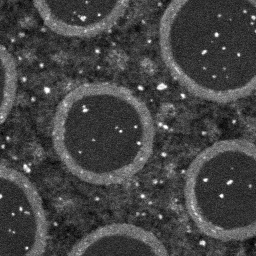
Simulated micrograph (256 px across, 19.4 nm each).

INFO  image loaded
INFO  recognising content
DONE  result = raised bodies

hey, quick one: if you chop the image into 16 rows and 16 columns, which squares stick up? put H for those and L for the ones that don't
LLLHHHHHLLLHHHHH
LLLHHHHLLLHHHHHH
LLLLLLLLLLHHHHHH
LLLLLLLLLLHHHHHH
HLLLLLLLLLLHHHHH
HLLLLLLLLLLLHHHH
LLLLHHHHHLLLLLLL
LLLLHHHHHLLLLLLL
LLLLHHHHHLLLLLLL
LLLLHHHHHLLLLHHH
LLLLLHHHLLLLHHHH
HHLLLLLLLLLLHHHH
HHLLLLLLLLLLHHHH
HHHLLLLLLLLLHHHH
HHHLLLHHLLLLLHHL
HHLLLHHHHHLLLLLL